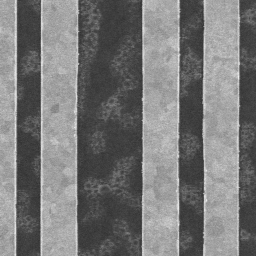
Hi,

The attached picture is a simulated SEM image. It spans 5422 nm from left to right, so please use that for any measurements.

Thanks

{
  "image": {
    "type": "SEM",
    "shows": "one or a few lines or trenches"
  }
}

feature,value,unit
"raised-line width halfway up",35.5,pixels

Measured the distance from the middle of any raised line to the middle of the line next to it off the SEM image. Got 1720 nm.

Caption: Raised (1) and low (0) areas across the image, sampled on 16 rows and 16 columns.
1001100001100110
1001100001100110
1001100001100110
1001100001100110
1001100001100110
1001100001100110
1001100001100110
1001100001100110
1001100001100110
1001100001100110
1001100001100110
1001100001100110
1001100001100110
1001100001100110
1001100001100110
1001100001100110